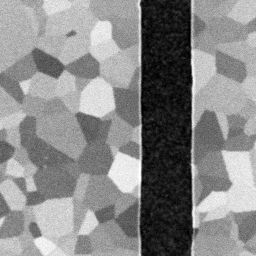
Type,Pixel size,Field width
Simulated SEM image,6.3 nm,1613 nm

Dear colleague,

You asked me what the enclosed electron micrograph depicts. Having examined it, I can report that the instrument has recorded one or a few lines or trenches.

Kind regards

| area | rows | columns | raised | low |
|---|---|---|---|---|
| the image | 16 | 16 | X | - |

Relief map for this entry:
XXXXXXXXX---XXXX
XXXXXXXXX---XXXX
XXXXXXXXX---XXXX
XXXXXXXXX---XXXX
XXXXXXXXX---XXXX
XXXXXXXXX---XXXX
XXXXXXXXXX--XXXX
XXXXXXXXX---XXXX
XXXXXXXXX---XXXX
XXXXXXXXX---XXXX
XXXXXXXXX---XXXX
XXXXXXXXX---XXXX
XXXXXXXXX---XXXX
XXXXXXXXX---XXXX
XXXXXXXXX---XXXX
XXXXXXXXX---XXXX